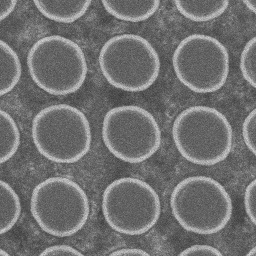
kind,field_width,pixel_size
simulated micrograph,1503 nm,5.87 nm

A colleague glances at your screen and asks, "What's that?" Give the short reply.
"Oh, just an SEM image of a regular array of raised bodies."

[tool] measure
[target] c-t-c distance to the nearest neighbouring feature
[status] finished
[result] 410 nanometers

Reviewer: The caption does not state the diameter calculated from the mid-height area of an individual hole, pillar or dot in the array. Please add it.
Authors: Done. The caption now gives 0.319 micrometres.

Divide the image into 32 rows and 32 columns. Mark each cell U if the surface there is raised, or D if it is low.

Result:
UUDDDUUUUUUDDUUUUUUUDDUUUUUUDDDU
UDDDDUUUUUDDDDUUUUUDDDDUUUUDDDDD
DDDDDDDDDDDDDDDDDDDDDDDDDDDDDDDD
DDDDDDDDDDDDDDDDDDDDDDDDDDDDDDDD
DDDDDDDDDDDDDDDDDDDDDDDDDDDDDDDD
DDDDDUUUUDDDDDUUUUDDDDDUUUUDDDDU
UUDDUUUUUUDDDUUUUUUDDDUUUUUUDDDU
UUDDUUUUUUDDDUUUUUUUDDUUUUUUDDUU
UUDDUUUUUUDDDUUUUUUUDDUUUUUUDDUU
UUDDUUUUUUDDDUUUUUUDDDUUUUUUDDDU
UUDDDUUUUUDDDDUUUUDDDDDUUUUUDDDD
DDDDDDUUDDDDDDDDDDDDDDDDDDDDDDDD
DDDDDDDDDDDDDDDDDDDDDDDDDDDDDDDD
DDDDDDDUUDDDDDDDUDDDDDDDDDDDDDDD
UDDDDUUUUUDDDDUUUUUDDDDUUUUUDDDU
UUDDUUUUUUUDDUUUUUUDDDUUUUUUDDDU
UUDDUUUUUUUDDUUUUUUUDDUUUUUUUDDU
UUDDUUUUUUUDDUUUUUUUDDUUUUUUUDDU
UUDDDUUUUUUDDDUUUUUDDDUUUUUUUDDU
UDDDDDUUUUDDDDDUUUDDDDDUUUUUDDDD
DDDDDDDDDDDDDDDDDDDDDDDDDDDDDDDD
DDDDDDDDDDDDDDDDDDDDDDDDDDDDDDDD
DDDDDDUUDDDDDDDDDDDDDDDDUUDDDDDD
UDDDDUUUUUDDDDUUUUUDDDUUUUUUDDDU
UUDDUUUUUUDDDUUUUUUDDDUUUUUUDDDU
UUDDUUUUUUUDDUUUUUUUDDUUUUUUUDDU
UUDDUUUUUUUDDUUUUUUUDDUUUUUUUDDU
UUDDDUUUUUUDDUUUUUUDDDUUUUUUDDDD
UDDDDDUUUUDDDDUUUUDDDDDDUUUDDDDD
DDDDDDDDDDDDDDDDDDDDDDDDDDDDDDDD
DDDDDDDDDDDDDDDDDDDDDDDDDDDDDDDD
DDDDDDUUUUDDDDDUUDDDDDDUUUUDDDDU